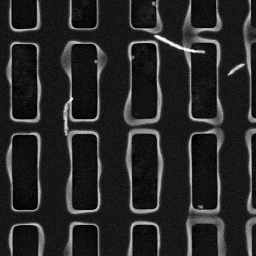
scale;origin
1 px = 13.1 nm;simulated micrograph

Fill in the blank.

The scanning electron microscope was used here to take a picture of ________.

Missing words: groups of lines, slits or small figures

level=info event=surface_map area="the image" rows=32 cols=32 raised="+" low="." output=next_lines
+....++++...++++....++++...++++.
+....++++...++++....++++...++++.
+....++++...++++....++++...++++.
++..+++++...+++++...++++...++++.
+++++++++++++++++++++++++++++++.
++..+++++..++++++..++++....++++.
+....+++....++++....++++...++++.
+....+++.....+++....++++...++++.
+....+++....++++....++++...++++.
+....++++...++++....++++...++++.
+....++++...++++....++++...++++.
+....++++...++++....++++...++++.
+....++++...++++....++++...++++.
+....++++...++++....++++...++++.
+....++++...++++....++++...++++.
++++++++++++++++++++++++++++++++
+++++++++++++++++..+++++++++++++
+....++++...++++....++++...++++.
+....++++...++++....++++...++++.
+....++++...++++....++++...++++.
+....++++...++++....++++...++++.
+....++++...++++....++++...++++.
+....++++...++++....++++...++++.
+....++++...++++....++++...++++.
+....++++...++++....++++...++++.
++...++++...++++....++++...++++.
++++++++++++++++++++++++++++++++
++++++++++++++++++++++++++++++++
++...++++...++++....++++....+++.
+....++++...++++....++++....+++.
+....++++...++++....++++....+++.
+....++++...++++....++++....+++.